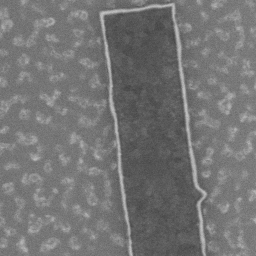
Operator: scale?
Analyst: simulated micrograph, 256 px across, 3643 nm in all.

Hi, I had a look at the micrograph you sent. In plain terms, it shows one or a few lines or trenches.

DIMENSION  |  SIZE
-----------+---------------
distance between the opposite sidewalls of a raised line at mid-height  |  1030 nm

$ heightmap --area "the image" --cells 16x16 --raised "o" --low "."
.........oo.....
......ooooo.....
.......oooo.....
.......oooo.....
.......oooo.....
.......oooo.....
.......ooooo....
.......ooooo....
.......ooooo....
.......ooooo....
.......ooooo....
........oooo....
........ooooo...
........ooooo...
........ooooo...
........ooooo...